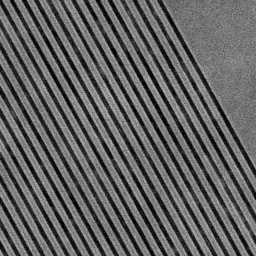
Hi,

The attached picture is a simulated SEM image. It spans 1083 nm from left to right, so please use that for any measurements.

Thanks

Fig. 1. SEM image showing parallel lines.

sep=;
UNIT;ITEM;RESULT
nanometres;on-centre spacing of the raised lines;45.4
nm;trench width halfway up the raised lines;18.5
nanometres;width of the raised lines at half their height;26.4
